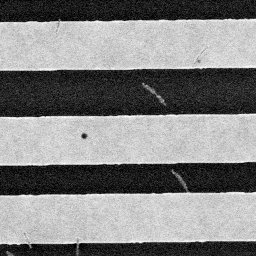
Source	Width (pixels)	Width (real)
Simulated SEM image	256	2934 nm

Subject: lines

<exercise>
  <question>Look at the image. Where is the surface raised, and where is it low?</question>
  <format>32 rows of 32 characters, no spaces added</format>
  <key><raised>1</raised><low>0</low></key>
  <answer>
00000000000000000000000000000000
00000000000000000000000000000000
00000000000000000000000000001011
11111111111111111111111111111111
11111111111111111111111111111111
11111111111111111111111111111111
11111111111111111111111111111111
11111111111111111111111111111111
11111111111111111111111111000000
00000000000000000000000000000000
00000000000000000000000000000000
00000000000000000000000000000000
00000000000000000000000000000000
00000000000000000000000000000000
00000000000000000000111111111111
11111111111111111111111111111111
11111111111111111111111111111111
11111111111111111111111111111111
11111111111111111111111111111111
11111111111111111111111111111111
11111100000000000000000000000000
00000000000000000000000000000000
00000000000000000000000000000000
00000000000000000000000000000000
00111111111111111111111111111111
11111111111111111111111111111111
11111111111111111111111111111111
11111111111111111111111111111111
11111111111111111111111111111111
11111111111111111111111111111111
00010000000000000000000000000000
00000000000000000000000000000000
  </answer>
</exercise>